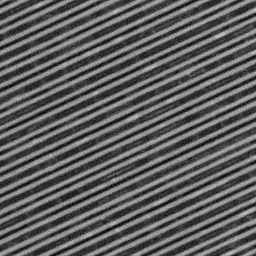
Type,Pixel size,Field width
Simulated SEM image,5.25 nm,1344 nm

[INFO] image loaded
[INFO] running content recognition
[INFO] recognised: parallel lines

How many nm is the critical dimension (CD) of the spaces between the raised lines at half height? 28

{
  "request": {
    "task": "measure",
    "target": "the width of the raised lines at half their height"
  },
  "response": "18.5 nm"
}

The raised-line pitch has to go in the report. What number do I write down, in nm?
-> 50.1